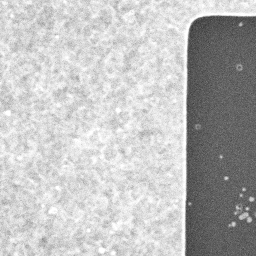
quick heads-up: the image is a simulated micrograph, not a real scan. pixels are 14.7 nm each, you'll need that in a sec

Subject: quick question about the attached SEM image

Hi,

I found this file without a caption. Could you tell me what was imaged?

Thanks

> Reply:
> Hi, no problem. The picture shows wiring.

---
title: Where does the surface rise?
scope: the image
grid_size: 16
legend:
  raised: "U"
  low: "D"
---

UUUUUUUUUUUUUUUU
UUUUUUUUUUUUDDDD
UUUUUUUUUUUUDDDD
UUUUUUUUUUUUDDDD
UUUUUUUUUUUUDDDD
UUUUUUUUUUUUDDDD
UUUUUUUUUUUUDDDD
UUUUUUUUUUUUDDDD
UUUUUUUUUUUUDDDD
UUUUUUUUUUUUDDDD
UUUUUUUUUUUUDDDD
UUUUUUUUUUUUDDDD
UUUUUUUUUUUUDDDD
UUUUUUUUUUUUDDDD
UUUUUUUUUUUUDDDD
UUUUUUUUUUUUDDDD